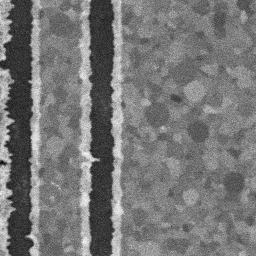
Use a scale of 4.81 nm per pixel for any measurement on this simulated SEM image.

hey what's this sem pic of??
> one or a few lines or trenches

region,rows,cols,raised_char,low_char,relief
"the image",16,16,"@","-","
--@@@--@@@@@@@@@
--@@@--@@@@@@@@@
--@@@--@@@@@@@@@
--@@@--@@@@@@@@@
--@@@--@@@@@@@@@
--@@@--@@@@@@@@@
--@@@--@@@@@@@@@
--@@@--@@@@@@@@@
--@@@--@@@@@@@@@
--@@@--@@@@@@@@@
--@@@--@@@@@@@@@
--@@@--@@@@@@@@@
--@@@--@@@@@@@@@
--@@@--@@@@@@@@@
--@@@--@@@@@@@@@
--@@@--@@@@@@@@@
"